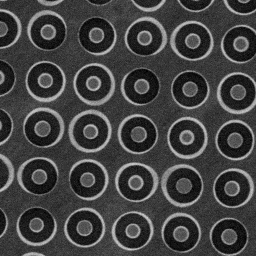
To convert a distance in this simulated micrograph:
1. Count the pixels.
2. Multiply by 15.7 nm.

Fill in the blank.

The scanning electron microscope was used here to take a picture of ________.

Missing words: an array of small figures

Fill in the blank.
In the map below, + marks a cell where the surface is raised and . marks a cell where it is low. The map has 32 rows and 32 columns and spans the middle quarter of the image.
++++++...+++++++++++++++++++++++
++++.......++++++....+++++++++++
+++.........++++.......++++++...
+++....+....+++........+++++....
+++...+++...+++...+++...+++.....
+++...+++...+++...+++...+++...++
+++.........+++...+++...+++...++
++++........+++........++++...++
++++.......+++++.......+++++....
++++++...++++++++.....++++++....
++++++++++++++++++++++++++++++..
++++++++++++++++++++++++++++++++
+++++....+++++++++++++++++++++++
+++.......++++++.....+++++++++++
++.........++++.......++++++....
++.........+++.........++++.....
++...+++...+++...+++...++++.....
++...+++...+++...+++...+++....++
++.........+++...+++...+++...+++
++.........+++.........+++....++
+++.......+++++.......+++++.....
+++++...++++++++.....++++++.....
++++++++++++++++++++++++++++....
++++++++++++++++++++++++++++++++
++++...+++++++++++++++++++++++++
+++......+++++++....+++++++++.++
++........++++........+++++.....
++...+....++++........++++......
+...+++....++....++....++.......
++..+++....++...+++....++....+++
++...++...+++....++....++...++++
++........++++........+++...++++